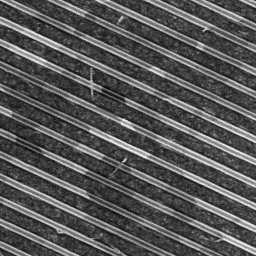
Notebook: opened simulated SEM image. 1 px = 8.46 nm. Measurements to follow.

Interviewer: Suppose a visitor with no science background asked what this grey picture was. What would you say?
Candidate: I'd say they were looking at parallel lines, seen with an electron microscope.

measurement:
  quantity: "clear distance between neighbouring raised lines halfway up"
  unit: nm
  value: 134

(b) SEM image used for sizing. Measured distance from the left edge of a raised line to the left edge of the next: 172 nanometers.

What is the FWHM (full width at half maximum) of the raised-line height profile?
41.2 nanometers